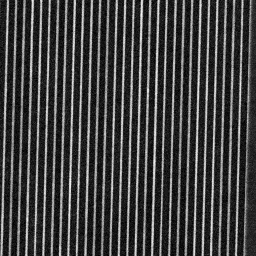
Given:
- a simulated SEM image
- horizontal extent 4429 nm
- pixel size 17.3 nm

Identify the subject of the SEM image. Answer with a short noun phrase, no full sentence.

parallel lines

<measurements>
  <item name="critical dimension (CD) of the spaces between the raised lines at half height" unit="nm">125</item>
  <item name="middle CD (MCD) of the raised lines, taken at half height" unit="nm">30.3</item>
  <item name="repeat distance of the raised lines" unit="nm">145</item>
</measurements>